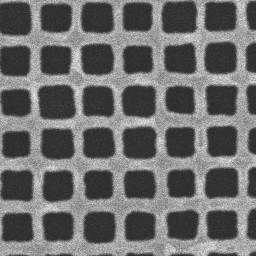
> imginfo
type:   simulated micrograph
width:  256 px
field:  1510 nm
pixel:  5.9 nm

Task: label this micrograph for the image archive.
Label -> a regular array of holes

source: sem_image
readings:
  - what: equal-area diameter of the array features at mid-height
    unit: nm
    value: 198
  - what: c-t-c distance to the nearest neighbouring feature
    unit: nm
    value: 240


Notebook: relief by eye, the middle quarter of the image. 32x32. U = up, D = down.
DDUUDDDDDDDDDUUDDDDDDDUUUDDDDDDD
DDUUUDDDDDDDUUUDDDDDDDUUUDDDDDDD
DUUUUUDDDDDUUUUUDDUUUUUUUUUUUUUD
UUUUUUUUUUUUUUUUUUUUUUUUUUUUUUUU
UUUUUUUUUUUUUUUUUUUUUUUUUUUUUUUU
DUUUUUUUUDUUUUUUDDDDUDUUUUUUDDDU
DDUUUDDDDDDDUUUDDDDDDDDUUDDDDDDD
DDDUUDDDDDDDUUDDDDDDDDDUUDDDDDDD
DDDUDDDDDDDDUUDDDDDDDDDUUDDDDDDD
DDDUDDDDDDDDDUDDDDDDDDDUUDDDDDDD
DDDUUDDDDDDDDUDDDDDDDDDUUUDDDDDD
DDDUUDDDDDDDDUDDDDDDDDDUUUDDDDDD
DDDUUDDDDDDDUUUDDDDDDDDUUUUUUDDD
DDUUUUUUUUUUUUUUUUUUDUUUUUUUUUUU
UUUUUUUUUUUUUUUUUUUUUUUUUUUUUUUU
UUUUUUUUUUUUUUUUUUUUUUUUUUUUUUUU
DDUUUDDDDDDDUUUDDDDDDDDUUUDDDDDD
DDUUDDDDDDDDUUDDDDDDDDDUUDDDDDDD
DDDUUDDDDDDDDUDDDDDDDDDUUDDDDDDD
DDDUUDDDDDDDDUUDDDDDDDDUUDDDDDDD
DDDUUDDDDDDDDUUDDDDDDDDUUDDDDDDD
DDDUUDDDDDDDDUUDDDDDDDDUUDDDDDDD
DDDUUDDDDDDDDUUDDDDDDDDUUUDDDDDD
DDUUUUDDDDDUUUUUDDDDDDUUUUUDDDUU
UUUUUUUUUUUUUUUUUUUUUUUUUUUUUUUU
UUUUUUUUUUUUUUUUUUUUUUUUUUUUUUUU
DUUUUUUUUUUUUUUUUUUDDUUUUUUDDDDD
DDUUUDDDDDDDUUUDDDDDDDDUUUDDDDDD
DDUUUDDDDDDDUUUDDDDDDDDUUUDDDDDD
DDUUUDDDDDDDUUUDDDDDDDDUUUDDDDDD
DDUUUDDDDDDDUUUDDDDDDDDUUUDDDDDD
DDUUUDDDDDDDUUUDDDDDDDDUUUDDDDDD